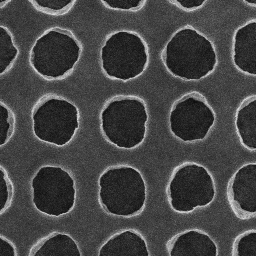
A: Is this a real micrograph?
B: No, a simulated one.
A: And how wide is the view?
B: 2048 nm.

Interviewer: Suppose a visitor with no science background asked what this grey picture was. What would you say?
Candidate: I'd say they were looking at a regular array of holes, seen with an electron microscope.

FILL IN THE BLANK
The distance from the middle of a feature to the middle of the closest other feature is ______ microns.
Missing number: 0.542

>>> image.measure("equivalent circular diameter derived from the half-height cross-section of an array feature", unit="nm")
369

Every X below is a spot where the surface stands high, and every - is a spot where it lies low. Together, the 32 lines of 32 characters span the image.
XXXXX----XXXX----XXXXX---XXXXXXX
XXXXXXXXXXXXXXXXXXXXXXXXXXXXXXXX
XXXXXXXXXXXXXXXXXXXXXXXXXXXXXXXX
XXXXXXXXXXXXXXXXXXXXXXXXXXXXXX--
-XXXX----XXXXX---XXXXX---XXXXX--
--XXX-----XXX-----XXX-----XXX---
--XX------XXX-----XXX------XX---
--XX------XXX-----XXX------XX---
-XXX-----XXXX-----XXX------XXX--
XXXXXX--XXXXXX---XXXXX---XXXXXXX
XXXXXXXXXXXXXXXXXXXXXXXXXXXXXXXX
XXXXXXXXXXXXXXXXXXXXXXXXXXXXXXXX
XXXXXX-XXXXXXX----XXXX---XXXXXXX
-XXX-----XXXX-----XXXX----XXXX--
-XXX------XXX-----XXX------XXX--
--XX------XXX-----XXX-----XXXX--
--XX-----XXXX-----XXXX----XXXX--
-XXXX----XXXXX----XXXXX-XXXXXX--
XXXXXXXXXXXXXXXXXXXXXXXXXXXXXXX-
XXXXXXXXXXXXXXXXXXXXXXXXXXXXXXXX
XXXXXXXXXXXXXXXXXXXXXXXXXXXXXXXX
XXXXX---XXXXX----XXXXX----XXXX--
-XXX-----XXXX-----XXXX----XXX---
-XXX-----XXXX-----XXX------XX---
-XXX-----XXX------XXX------XX---
-XXX-----XXXX-----XXX-----XXX---
XXXXX---XXXXX----XXXXXXXXXXXXXX-
XXXXXXXXXXXXXXXXXXXXXXXXXXXXXXXX
XXXXXXXXXXXXXXXXXXXXXXXXXXXXXXXX
XXXXXXX-XXXXXX----XXXX----XXXX--
-XXXX----XXXX-----XXXX-----XXX--
--XX------XXX-----XXX------XXX--